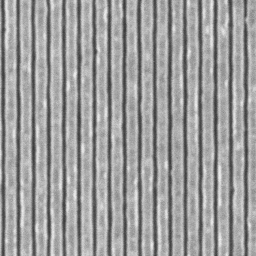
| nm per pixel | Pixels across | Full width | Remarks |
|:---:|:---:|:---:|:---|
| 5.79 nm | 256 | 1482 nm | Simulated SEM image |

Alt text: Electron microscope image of parallel lines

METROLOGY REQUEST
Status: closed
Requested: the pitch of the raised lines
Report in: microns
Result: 0.088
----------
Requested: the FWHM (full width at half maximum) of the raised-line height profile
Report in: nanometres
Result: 61.6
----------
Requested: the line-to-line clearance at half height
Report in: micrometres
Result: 0.0282